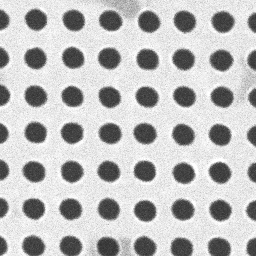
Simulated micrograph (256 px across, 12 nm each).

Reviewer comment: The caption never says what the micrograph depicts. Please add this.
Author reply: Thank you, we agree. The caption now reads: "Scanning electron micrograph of a regular array of holes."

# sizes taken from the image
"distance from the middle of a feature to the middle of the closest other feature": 438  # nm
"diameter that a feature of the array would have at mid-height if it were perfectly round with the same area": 262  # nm